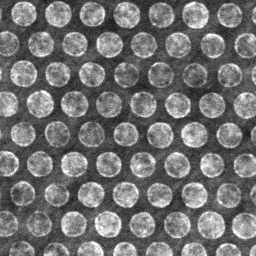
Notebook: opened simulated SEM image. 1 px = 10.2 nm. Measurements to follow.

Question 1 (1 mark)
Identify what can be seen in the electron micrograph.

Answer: a regular array of raised bodies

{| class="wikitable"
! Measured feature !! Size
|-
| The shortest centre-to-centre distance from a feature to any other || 350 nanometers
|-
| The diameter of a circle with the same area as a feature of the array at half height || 251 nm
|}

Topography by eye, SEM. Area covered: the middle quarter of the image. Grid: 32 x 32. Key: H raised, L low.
LLLLLHHHHLLLLLHHHLLLLLHHHHLLLLLH
HLLLHHHHHHLLLHHHHHLLLLHHHHHLLLHH
HLLLHHHHHHLLLHHHHHHLLHHHHHHLLLHH
HLLLHHHHHHLLLHHHHHLLLHHHHHHLLLHH
HLLLLHHHHLLLLHHHHHLLLLHHHHHLLLHH
LLLLLLLLLLLLLLLHHLLLLLLHHLLLLLLH
LLLLLLLLLLLLLLLLLLLLLLLLLLLLLLLL
LHHHLLLLLLHHLLLLLLHHHLLLLLLHHHLL
HHHHHLLLLHHHHHLLLHHHHHLLLLHHHHHL
HHHHHHLLHHHHHHLLLHHHHHHLLLHHHHHL
HHHHHHLLHHHHHHLLLHHHHHHLLLHHHHHL
HHHHHHLLLHHHHHLLLHHHHHHLLLHHHHHL
LHHHHLLLLHHHHLLLLLHHHHLLLLLHHHHL
LLLLLLLLLLLLLLLLLLLLLLLLLLLLLLLL
LLLLLLLLLLLLLLLLLLLLLLLLLLLLLLLL
LLLLLHHHHLLLLLHHHLLLLLHHHHLLLLLH
HLLLHHHHHHLLLHHHHHLLLHHHHHHLLLHH
HLLLHHHHHHLLLHHHHHLLLHHHHHHLLHHH
HLLLHHHHHHLLLHHHHHLLLHHHHHHLLLHH
HLLLHHHHHLLLLHHHHHLLLHHHHHHLLLHH
LLLLLLHLLLLLLLLLLLLLLLHHHHLLLLLL
LLLLLLLLLLLLLLLLLLLLLLLLLLLLLLLL
LHHHLLLLLLHHHLLLLLHHHLLLLLLHHLLL
HHHHHLLLHHHHHHLLLHHHHHLLLLHHHHHL
HHHHHHLLHHHHHHLLLHHHHHHLLLHHHHHL
HHHHHHLLHHHHHHLLLHHHHHHLLHHHHHHL
HHHHHLLLHHHHHHLLLHHHHHLLLLHHHHHL
LHHHHLLLLHHHHLLLLLHHHHLLLLHHHHHL
LLLLLLLLLLLLLLLLLLLLLLLLLLLLLLLL
LLLLLLLLLLLLLLLLLLLLLLLLLLLLLLLL
LLLLLHHHHLLLLHHHHHLLLLHHHHLLLLHH
HLLLHHHHHHLLLHHHHHLLLHHHHHHLLLHH